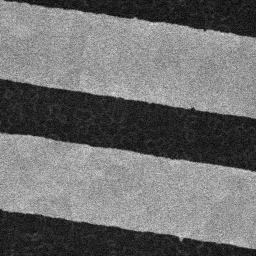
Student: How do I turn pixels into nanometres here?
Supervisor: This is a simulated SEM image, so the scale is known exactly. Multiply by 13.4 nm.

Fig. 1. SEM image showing one or a few lines or trenches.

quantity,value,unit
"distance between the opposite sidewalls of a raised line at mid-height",1030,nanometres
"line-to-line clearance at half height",52.2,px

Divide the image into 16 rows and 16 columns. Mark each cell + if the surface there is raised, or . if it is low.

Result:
+++.............
+++++++++++.....
++++++++++++++++
++++++++++++++++
++++++++++++++++
....++++++++++++
..........++++++
................
++..............
++++++++........
+++++++++++++++.
++++++++++++++++
++++++++++++++++
...+++++++++++++
.........+++++++
................